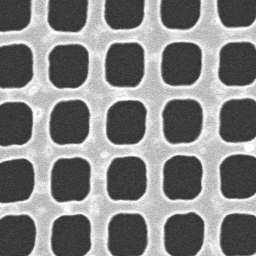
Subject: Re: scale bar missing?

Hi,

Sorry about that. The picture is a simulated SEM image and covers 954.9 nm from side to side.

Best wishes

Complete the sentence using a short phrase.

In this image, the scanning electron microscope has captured a regular array of holes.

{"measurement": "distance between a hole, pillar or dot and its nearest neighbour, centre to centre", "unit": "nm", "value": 210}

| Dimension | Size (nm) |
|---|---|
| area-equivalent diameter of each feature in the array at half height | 168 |